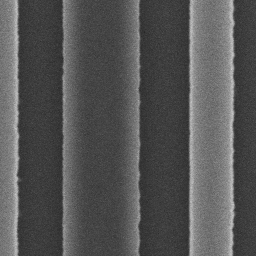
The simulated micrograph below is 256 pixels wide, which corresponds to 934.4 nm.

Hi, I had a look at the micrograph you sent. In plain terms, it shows lines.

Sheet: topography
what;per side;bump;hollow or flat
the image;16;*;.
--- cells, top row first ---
*...*****...***.
*...*****...***.
*...*****...***.
*...*****...***.
*...*****...***.
*...*****...***.
*...*****...***.
*...*****...***.
*...*****...***.
*...*****...***.
*...*****...***.
*...*****...***.
*...*****...***.
*...*****...***.
*...*****...***.
*...*****...***.